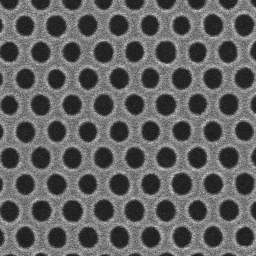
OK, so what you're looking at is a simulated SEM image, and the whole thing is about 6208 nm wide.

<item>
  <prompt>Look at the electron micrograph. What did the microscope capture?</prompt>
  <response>a regular array of holes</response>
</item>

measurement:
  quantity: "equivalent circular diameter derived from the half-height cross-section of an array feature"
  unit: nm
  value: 517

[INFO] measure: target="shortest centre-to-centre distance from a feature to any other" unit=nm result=740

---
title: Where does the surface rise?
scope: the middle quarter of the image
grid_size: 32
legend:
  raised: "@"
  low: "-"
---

@@@@@@@@@@@@@@@@@@@@@@@@@@@@@@@@
@@@@---@@@@@---@@@@@---@@@@----@
@@@@----@@@-----@@@-----@@@-----
-@@@-----@@-----@@@-----@@@-----
@@@@-----@@-----@@@-----@@@-----
@@@@----@@@@----@@@@---@@@@-----
@@@@@-@@@@@@@@-@@@@@@@@@@@@@@-@@
@@@@@@@@@@@@@@@@@-@@@@@@---@@@@@
----@@@@----@@@-----@@@-----@@@-
----@@@-----@@@-----@@@-----@@@-
-----@@------@@-----@@@-----@@@-
----@@@-----@@@@----@@@-----@@@-
@---@@@@----@@@@---@@@@@---@@@@@
@@@@@@@@@@@@@@@@@@@@@@@@@@@@@@@@
@@@@@--@@@@@---@@@@@---@@@@@---@
@@@@----@@@@----@@@-----@@@-----
-@@@----@@@-----@@@-----@@@-----
-@@@----@@@-----@@@-----@@@-----
@@@@----@@@@----@@@@---@@@@@---@
@@@@@--@@@@@@--@@@@@@@@@@@@@@@@@
@@@@@@@@@@@@@@@@@@@@@@@@@-@@@@@@
----@@@@----@@@@---@@@@@---@@@@-
----@@@@----@@@-----@@@-----@@@-
-----@@-----@@@-----@@@-----@@@-
-----@@-----@@@-----@@@-----@@@-
----@@@@----@@@@---@@@@@---@@@@@
@@@@@@@@@@@@@@@@@@@@@@@@@@@@@@@@
@@@@@--@@@@@@--@@@@@@--@@@@@---@
@@@@----@@@@----@@@@----@@@-----
-@@@----@@@-----@@@-----@@@-----
-@@-----@@@------@@-----@@@-----
@@@@----@@@@----@@@-----@@@-----